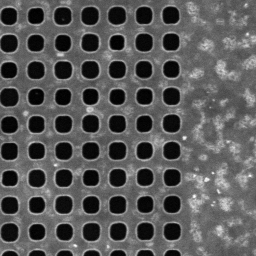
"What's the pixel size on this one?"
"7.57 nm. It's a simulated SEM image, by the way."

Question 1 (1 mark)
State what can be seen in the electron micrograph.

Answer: a regular array of holes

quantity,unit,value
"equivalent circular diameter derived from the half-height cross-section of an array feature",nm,138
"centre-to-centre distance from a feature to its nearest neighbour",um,0.202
